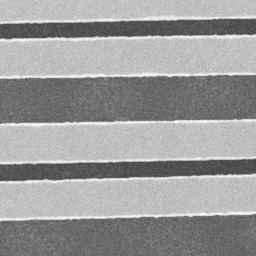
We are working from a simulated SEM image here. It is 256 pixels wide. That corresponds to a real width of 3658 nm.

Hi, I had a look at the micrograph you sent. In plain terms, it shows lines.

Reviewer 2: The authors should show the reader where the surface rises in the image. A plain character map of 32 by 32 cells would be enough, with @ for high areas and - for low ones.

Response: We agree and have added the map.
@@@@@@@@@@@@@@@@@@@@@@@@@@@@@@@@
@@@@@@@@@@@@@@@@@@@@@@@@@@@@@@@@
@@@@@@@@@@@@@@@-----------------
--------------------------------
--------------------------@@@@@@
@@@@@@@@@@@@@@@@@@@@@@@@@@@@@@@@
@@@@@@@@@@@@@@@@@@@@@@@@@@@@@@@@
@@@@@@@@@@@@@@@@@@@@@@@@@@@@@@@@
@@@@@@@@@@@@@@@@@@@@@@@@@@@@@@@@
@@@@@@@@@@@@@@@@@@@@@@----------
--------------------------------
--------------------------------
--------------------------------
--------------------------------
--------------------------------
@@@@@@@@@@@@@@@@@@@@@@@@@@@@@@@@
@@@@@@@@@@@@@@@@@@@@@@@@@@@@@@@@
@@@@@@@@@@@@@@@@@@@@@@@@@@@@@@@@
@@@@@@@@@@@@@@@@@@@@@@@@@@@@@@@@
@@@@@@@@@@@@@@@@@@@@@@@@@@@@@@@@
--------------------------------
--------------------------------
-----@--@@@@@@@@@@@@@@@@@@@@@@@@
@@@@@@@@@@@@@@@@@@@@@@@@@@@@@@@@
@@@@@@@@@@@@@@@@@@@@@@@@@@@@@@@@
@@@@@@@@@@@@@@@@@@@@@@@@@@@@@@@@
@@@@@@@@@@@@@@@@@@@@@@@@@@@@@@@@
@-------------------------------
--------------------------------
--------------------------------
--------------------------------
--------------------------------